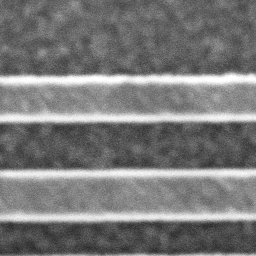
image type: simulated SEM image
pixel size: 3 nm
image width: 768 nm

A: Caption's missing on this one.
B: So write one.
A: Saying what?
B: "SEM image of one or a few lines or trenches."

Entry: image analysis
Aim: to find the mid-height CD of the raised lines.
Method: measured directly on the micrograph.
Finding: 43.6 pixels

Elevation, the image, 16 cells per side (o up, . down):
................
................
................
................
................
oooooooooooooooo
oooooooooooooooo
................
................
................
................
oooooooooooooooo
oooooooooooooooo
oooooooooooooooo
................
................